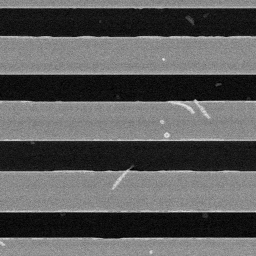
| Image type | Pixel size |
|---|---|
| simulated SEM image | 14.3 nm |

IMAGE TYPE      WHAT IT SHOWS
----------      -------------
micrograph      lines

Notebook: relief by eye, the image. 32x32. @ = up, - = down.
@@@@@@@@@@@@@@@@@@@@@@@@@@@@@@@@
--------------------------------
--------------------------------
--------------------------------
--------------------------------
@@@@@@@@@@@@@@@@@@@@@@@@@@@@@@@@
@@@@@@@@@@@@@@@@@@@@@@@@@@@@@@@@
@@@@@@@@@@@@@@@@@@@@@@@@@@@@@@@@
@@@@@@@@@@@@@@@@@@@@@@@@@@@@@@@@
--------------------------------
--------------------------------
--------------------------------
--------------------------------
@@@@@@@@@@@@@@@@@@@@@@@@@@@@@@@@
@@@@@@@@@@@@@@@@@@@@@@@@@@@@@@@@
@@@@@@@@@@@@@@@@@@@@@@@@@@@@@@@@
@@@@@@@@@@@@@@@@@@@@@@@@@@@@@@@@
@@@@@@@@@@@@@@@@@@@@@@@@@@@@@@@@
--------------------------------
--------------------------------
--------------------------------
@@@@@@@@@@@@@@@@@@@@@@@@@@@@@@@@
@@@@@@@@@@@@@@@@@@@@@@@@@@@@@@@@
@@@@@@@@@@@@@@@@@@@@@@@@@@@@@@@@
@@@@@@@@@@@@@@@@@@@@@@@@@@@@@@@@
@@@@@@@@@@@@@@@@@@@@@@@@@@@@@@@@
--------------------------------
--------------------------------
--------------------------------
--------------------------------
@@@@@@@@@@@@@@@@@@@@@@@@@@@@@@@@
@@@@@@@@@@@@@@@@@@@@@@@@@@@@@@@@